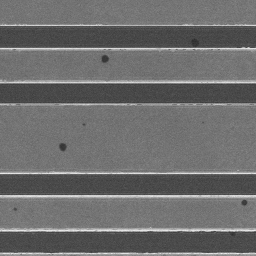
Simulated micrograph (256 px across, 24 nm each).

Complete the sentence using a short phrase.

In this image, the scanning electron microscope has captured lines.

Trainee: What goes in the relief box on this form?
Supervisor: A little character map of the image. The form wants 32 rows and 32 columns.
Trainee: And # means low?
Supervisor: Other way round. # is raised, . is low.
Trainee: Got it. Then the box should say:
################################
################################
################################
................................
................................
................................
################################
################################
################################
################################
................................
................................
................................
################################
################################
################################
################################
################################
################################
################################
################################
################################
................................
................................
################################
################################
################################
################################
################################
................................
................................
................................